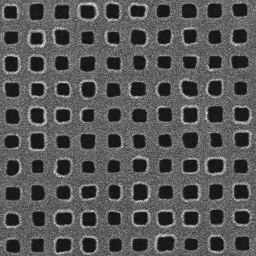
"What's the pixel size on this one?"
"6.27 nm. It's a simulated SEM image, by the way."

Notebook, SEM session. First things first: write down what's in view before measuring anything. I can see a regular array of holes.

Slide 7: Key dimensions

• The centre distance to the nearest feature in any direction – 0.157 µm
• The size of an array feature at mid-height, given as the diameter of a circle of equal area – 92.1 nm